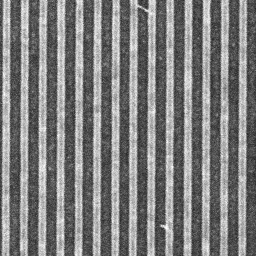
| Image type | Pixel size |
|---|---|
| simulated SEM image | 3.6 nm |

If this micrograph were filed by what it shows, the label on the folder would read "parallel lines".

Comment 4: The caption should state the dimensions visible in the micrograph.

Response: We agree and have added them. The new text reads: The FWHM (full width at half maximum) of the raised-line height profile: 0.0203 µm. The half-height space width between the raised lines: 44.1 nanometers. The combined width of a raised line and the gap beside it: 0.0655 microns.